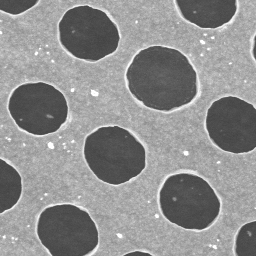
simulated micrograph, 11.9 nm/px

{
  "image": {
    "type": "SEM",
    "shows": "holes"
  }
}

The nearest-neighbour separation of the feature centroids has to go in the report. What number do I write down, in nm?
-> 1050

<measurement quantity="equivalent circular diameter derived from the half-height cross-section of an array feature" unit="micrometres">0.691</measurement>